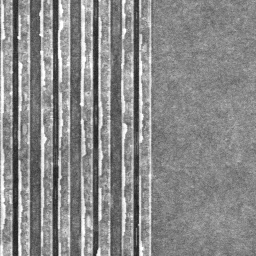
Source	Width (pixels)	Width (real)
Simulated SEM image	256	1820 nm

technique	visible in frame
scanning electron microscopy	parallel lines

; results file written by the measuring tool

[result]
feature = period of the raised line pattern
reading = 141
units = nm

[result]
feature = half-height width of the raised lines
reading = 84.5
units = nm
